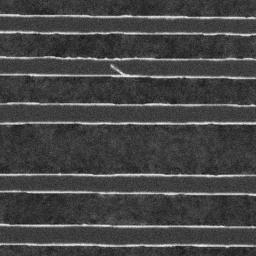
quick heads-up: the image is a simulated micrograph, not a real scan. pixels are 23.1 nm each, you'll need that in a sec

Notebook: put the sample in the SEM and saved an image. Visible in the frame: lines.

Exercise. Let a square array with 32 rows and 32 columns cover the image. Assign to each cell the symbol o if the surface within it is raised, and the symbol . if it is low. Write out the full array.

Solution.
................................
................................
oooooooooooooooooooooooooooooooo
oooooooooooooooooooooooooooooooo
................................
................................
................................
oooooooooooooooooooooooooooooooo
oooooooooooooooooooooooooooooooo
..............oooooooooooooooooo
................................
................................
................................
oooooooooooooooooooooooooooooooo
oooooooooooooooooooooooooooooooo
................................
................................
................................
................................
................................
................................
................................
oooooooooooooooooooooooooooooooo
oooooooooooooooooooooooooooooooo
................................
................................
................................
................................
oooooooooooooooooooooooooooooooo
oooooooooooooooooooooooooooooooo
oooooooooooooooooooooooooooooooo
................................